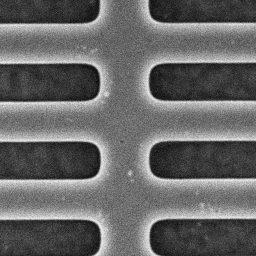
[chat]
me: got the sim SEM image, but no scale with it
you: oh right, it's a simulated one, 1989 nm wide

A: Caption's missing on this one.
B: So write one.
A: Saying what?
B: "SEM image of groups of lines, slits or small figures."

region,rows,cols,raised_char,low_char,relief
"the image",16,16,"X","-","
------XXX-------
-----XXXXXXXXXXX
XXXXXXXXXXXXXXXX
XXXXXXXXXXXXXXXX
------XXX-------
------XXX-------
XXXXXXXXXXXXXXXX
XXXXXXXXXXXXXXXX
XXXXXXXXXXXXXXXX
------XXX-------
------XXX-------
XXXXXXXXXXXXXXXX
XXXXXXXXXXXXXXXX
XXXXXXXXXXXXXXXX
------XXX-------
------XXX-------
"